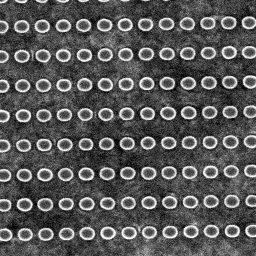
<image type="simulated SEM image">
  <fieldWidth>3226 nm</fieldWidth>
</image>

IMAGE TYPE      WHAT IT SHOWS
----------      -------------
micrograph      a regular array of raised bodies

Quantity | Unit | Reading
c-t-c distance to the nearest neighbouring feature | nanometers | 259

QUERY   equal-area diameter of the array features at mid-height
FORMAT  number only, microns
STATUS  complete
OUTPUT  0.167